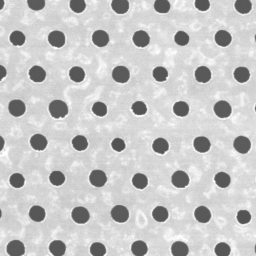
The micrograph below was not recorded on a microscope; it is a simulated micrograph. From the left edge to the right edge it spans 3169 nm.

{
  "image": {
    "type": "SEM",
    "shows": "a regular array of holes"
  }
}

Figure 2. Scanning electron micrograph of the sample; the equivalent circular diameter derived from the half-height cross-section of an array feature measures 0.209 micrometres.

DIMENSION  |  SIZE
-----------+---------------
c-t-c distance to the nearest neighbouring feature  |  39.4 pixels